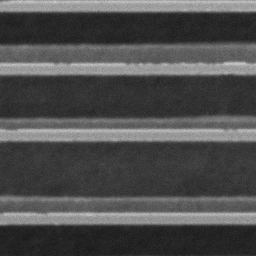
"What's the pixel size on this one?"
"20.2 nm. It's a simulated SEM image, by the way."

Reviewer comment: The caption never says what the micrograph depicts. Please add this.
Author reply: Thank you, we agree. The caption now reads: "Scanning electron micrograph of lines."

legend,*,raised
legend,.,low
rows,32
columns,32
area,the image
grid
********************************
................................
................................
................................
................................
................................
********************************
********************************
********************************
................................
................................
................................
................................
................................
................................
********************************
********************************
**.*.****.*****...*.*...*..*.*.*
................................
................................
................................
................................
................................
................................
................................
********************************
********************************
********************************
................................
................................
................................
................................